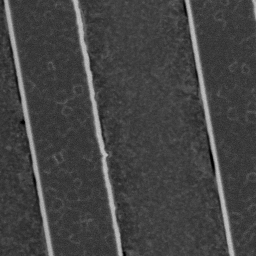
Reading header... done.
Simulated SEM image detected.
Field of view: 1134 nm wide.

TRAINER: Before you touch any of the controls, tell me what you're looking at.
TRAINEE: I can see one or a few lines or trenches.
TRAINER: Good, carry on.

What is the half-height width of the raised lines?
70.1 pixels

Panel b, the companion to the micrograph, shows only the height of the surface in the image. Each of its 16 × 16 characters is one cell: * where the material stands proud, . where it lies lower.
*****.......****
.****.......****
.****.......****
.****.......****
.*****......****
.*****.......***
.*****.......***
..****.......***
..****.......***
..****.......***
..*****.......**
..*****.......**
...****.......**
...****.......**
...****.......**
...*****......**